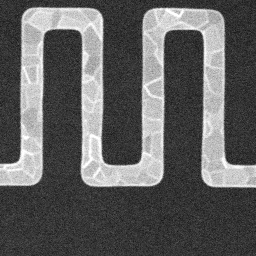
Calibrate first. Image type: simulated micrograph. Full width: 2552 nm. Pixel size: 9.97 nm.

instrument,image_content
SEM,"groups of lines, slits or small figures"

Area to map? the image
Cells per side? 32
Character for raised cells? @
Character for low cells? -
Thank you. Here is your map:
--------------------------------
---@@@@@@@@@-------@@--@@@@-----
---@@@@@@@@@@-----@@@@@@@@@@----
---@@@@@@@@@@-----@@@@@@@@@@----
---@@-----@@@-----@@@----@@@----
---@@-----@@@-----@@------@@----
---@@-----@@@-----@@------@@----
---@@-----@@@-----@@------@@----
---@@-----@@@-----@@------@@----
---@@-----@@@-----@@------@@----
---@@-----@@@-----@@------@@----
---@@-----@@@-----@@------@@----
---@@-----@@@-----@@------@@----
---@@-----@@@-----@@------@@----
---@@-----@@@-----@@------@@----
---@@-----@@@-----@@------@@----
---@@-----@@@-----@@-----@@@----
---@@-----@@@-----@@-----@@@----
---@@-----@@@-----@@-----@@@----
---@@-----@@@-----@@-----@@@----
-@@@@-----@@@----@@@-----@@@@---
@@@@@-----@@@@@@@@@@-----@@@@@@@
@@@@@-----@@@@@@@@@@------@@@@@@
--------------------------------
--------------------------------
--------------------------------
--------------------------------
--------------------------------
--------------------------------
--------------------------------
--------------------------------
--------------------------------